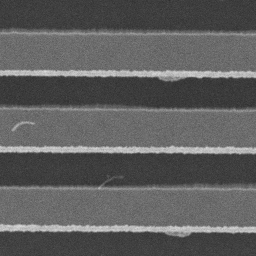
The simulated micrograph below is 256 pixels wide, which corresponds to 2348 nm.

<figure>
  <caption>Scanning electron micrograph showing lines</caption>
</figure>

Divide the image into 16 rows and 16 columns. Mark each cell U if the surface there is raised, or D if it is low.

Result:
DDDDDDDDDDDDDDDD
DDDDDDDDDDDDDDDD
UUUUUUUUUUUUUUUU
UUUUUUUUUUUUUUUU
UUUUUUUUUUUUUUUU
DDDDDDDDDDDDDDDD
DDDDDDDDDDDDDDDD
UUUUUUUUUUUUUUUU
UUUUUUUUUUUUUUUU
DDDDUDUUUUUUUUUU
DDDDDDDDDDDDDDDD
DDDDDDDDDDDDDDDD
UUUUUUUUUUUUUUUU
UUUUUUUUUUUUUUUU
DDDDDDDDDDUUDDDD
DDDDDDDDDDDDDDDD